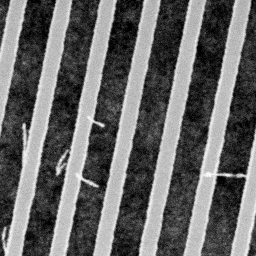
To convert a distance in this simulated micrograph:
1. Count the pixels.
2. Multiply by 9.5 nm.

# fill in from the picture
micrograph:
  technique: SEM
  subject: lines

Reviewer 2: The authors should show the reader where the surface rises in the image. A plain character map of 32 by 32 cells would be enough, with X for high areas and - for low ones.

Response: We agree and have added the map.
-XX----XX----X----XX----XX---XX-
-XX----XX---XX----XX----X----XX-
-XX----XX---XX----XX---XX----XX-
-XX---XX----XX---XX----XX----XX-
XX----XX----XX---XX----XX----XX-
XX----XX---XX----XX----XX---XX--
XX----XX---XX----XX---XX----XX--
XX----XX---XX----XX---XX----XX--
XX---XX----XX---XX----XX----XX--
X----XX----XX---XX----XX----XX--
X----XX----XX---XX----XX---XX---
X----XX---XX----XX---XXX---XX---
X----X----XX----XX---XX----XX---
X---XX----XX---XX----XX----XX---
----XX----XX---XX----XX----XX---
----XX----XX---XX----XX---XX----
----XX---XX----XX---XX----XX----
----X----XX----XX---XX----XX----
---XX----XX---XX----XX----XX----
---XX----XX---XX----XX----X----X
---XX---XX----XX----XX---XX----X
---XX---XX----XX---XX----XX----X
---XX---XX----XX---XX----XX----X
--XX----XX---XX----XX----XX----X
--XX----XX---XX----XX---XXX---XX
--XX----X----XX----XX---XX----XX
--XX---XX----XX----X----XX----XX
--X----XX----XX---XX----XX----XX
-XX----XX---XX----XX----XX----XX
-XX----XX---XX----XX----XX---XX-
-XX---XX----XX----XX---XX----XX-
-XX---XX----XX----X----XX----XX-